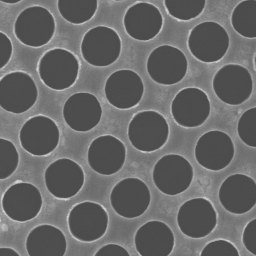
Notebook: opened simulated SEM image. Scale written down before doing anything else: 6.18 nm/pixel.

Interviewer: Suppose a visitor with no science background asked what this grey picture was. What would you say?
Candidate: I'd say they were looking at a regular array of holes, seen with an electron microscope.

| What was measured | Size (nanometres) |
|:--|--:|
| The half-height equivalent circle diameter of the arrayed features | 242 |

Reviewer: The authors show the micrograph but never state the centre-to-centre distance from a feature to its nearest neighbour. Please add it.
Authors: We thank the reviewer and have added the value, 297 nm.